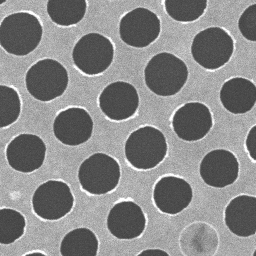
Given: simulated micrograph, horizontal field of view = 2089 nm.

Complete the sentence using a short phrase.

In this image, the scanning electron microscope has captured a regular array of holes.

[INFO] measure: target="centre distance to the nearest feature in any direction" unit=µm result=0.435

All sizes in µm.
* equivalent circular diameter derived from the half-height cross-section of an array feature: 0.329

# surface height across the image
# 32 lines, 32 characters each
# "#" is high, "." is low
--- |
######.....##########.....######
######.....#####...##....#####..
.....##...#####.....##..######..
.....##########.....######.###..
.....######..##.....####.....#..
.....####.....##...#####.....###
#...#####.....##########.....###
#####..##.....#####....#.....###
####....##...#####.....###.#####
###.....##########.....#########
###.....######..##.....#####....
..##....#####....##...######....
..###.######.....###########....
...######.###....######...##...#
..#####....##...######....######
.######.....##########....######
#######.....#####...##....#####.
##...##....#####.....##.#######.
#.....##########.....##########.
#.....#####...##.....#####...##.
#....#####.....#....#####.....##
###.######.....##########.....##
##########.....#####...##....###
#####....#....#####.....########
####.....##########.....######.#
####.....######..##.....#####...
..##.....#####....##..######....
...##########.....##########....
...###########....###########...
...#####....##...#######.#####.#
########....############.#######
########....######...###########